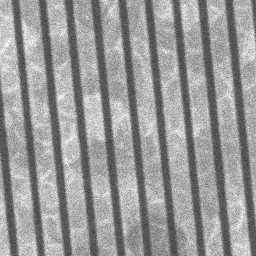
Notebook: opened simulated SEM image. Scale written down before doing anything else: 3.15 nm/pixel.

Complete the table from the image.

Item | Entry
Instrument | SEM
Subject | parallel lines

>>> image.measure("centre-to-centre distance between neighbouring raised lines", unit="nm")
83.6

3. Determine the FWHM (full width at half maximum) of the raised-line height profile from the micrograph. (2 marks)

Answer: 53.6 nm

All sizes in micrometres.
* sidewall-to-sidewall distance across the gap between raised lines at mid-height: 0.0282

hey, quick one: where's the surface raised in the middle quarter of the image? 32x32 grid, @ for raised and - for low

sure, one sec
@@--@@@@---@@@@--@@@@---@@@@---@
@@--@@@@---@@@@---@@@@--@@@@---@
@@--@@@@---@@@@---@@@@--@@@@---@
@@--@@@@---@@@@---@@@@--@@@@@--@
@@--@@@@@--@@@@---@@@@--@@@@@--@
@@---@@@@--@@@@---@@@@--@@@@@--@
@@---@@@@--@@@@@--@@@@---@@@@---
@@---@@@@--@@@@@--@@@@---@@@@---
@@---@@@@--@@@@@--@@@@---@@@@---
@@@--@@@@---@@@@--@@@@---@@@@---
@@@--@@@@---@@@@--@@@@@--@@@@---
@@@--@@@@---@@@@---@@@@--@@@@---
@@@--@@@@---@@@@---@@@@--@@@@@--
@@@--@@@@@--@@@@---@@@@--@@@@@--
@@@---@@@@--@@@@---@@@@--@@@@@--
@@@---@@@@--@@@@---@@@@--@@@@@--
@@@---@@@@--@@@@@--@@@@---@@@@--
@@@---@@@@--@@@@@--@@@@---@@@@--
@@@---@@@@--@@@@@--@@@@---@@@@--
@@@@--@@@@---@@@@--@@@@---@@@@--
@@@@--@@@@---@@@@--@@@@@--@@@@--
@@@@--@@@@---@@@@---@@@@--@@@@--
@@@@--@@@@---@@@@---@@@@--@@@@@-
@@@@--@@@@@--@@@@---@@@@--@@@@@-
@@@@---@@@@--@@@@---@@@@--@@@@@-
@@@@---@@@@--@@@@@--@@@@--@@@@@-
@@@@---@@@@--@@@@@--@@@@---@@@@-
@@@@---@@@@--@@@@@--@@@@---@@@@-
@@@@---@@@@--@@@@@--@@@@---@@@@-
-@@@@--@@@@---@@@@--@@@@---@@@@-
-@@@@--@@@@---@@@@--@@@@@--@@@@-
-@@@@--@@@@---@@@@---@@@@--@@@@-